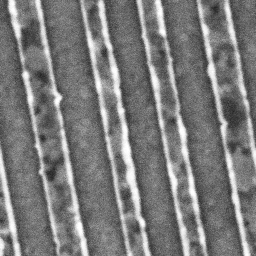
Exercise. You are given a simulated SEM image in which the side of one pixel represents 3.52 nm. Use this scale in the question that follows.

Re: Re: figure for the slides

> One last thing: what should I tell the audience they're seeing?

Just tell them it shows one or a few lines or trenches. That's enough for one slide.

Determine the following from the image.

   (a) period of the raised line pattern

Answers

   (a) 216 nm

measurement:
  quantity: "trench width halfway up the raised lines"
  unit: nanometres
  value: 132